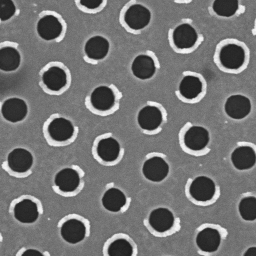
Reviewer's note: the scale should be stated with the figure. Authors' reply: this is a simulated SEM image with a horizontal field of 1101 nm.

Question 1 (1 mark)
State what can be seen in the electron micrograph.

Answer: a regular array of holes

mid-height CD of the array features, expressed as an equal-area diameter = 105 nm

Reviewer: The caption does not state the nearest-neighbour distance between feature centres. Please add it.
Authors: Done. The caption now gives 0.218 µm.